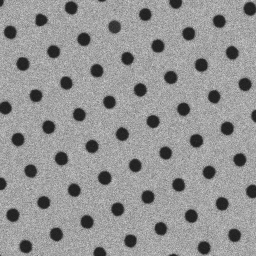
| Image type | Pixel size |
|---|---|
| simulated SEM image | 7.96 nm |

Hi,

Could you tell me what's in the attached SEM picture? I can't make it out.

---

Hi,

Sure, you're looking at a regular array of holes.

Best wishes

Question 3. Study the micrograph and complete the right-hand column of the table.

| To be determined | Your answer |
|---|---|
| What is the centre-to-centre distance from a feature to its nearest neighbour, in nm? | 262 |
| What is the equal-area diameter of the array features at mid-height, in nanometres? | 102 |